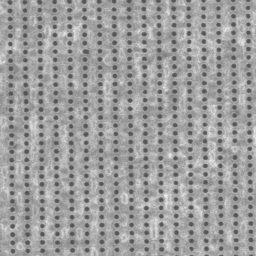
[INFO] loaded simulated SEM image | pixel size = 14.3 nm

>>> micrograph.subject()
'a regular array of holes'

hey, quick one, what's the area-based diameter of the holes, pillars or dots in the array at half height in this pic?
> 70.4 nm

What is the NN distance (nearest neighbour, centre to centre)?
116 nm